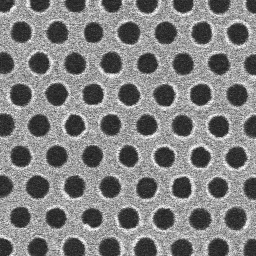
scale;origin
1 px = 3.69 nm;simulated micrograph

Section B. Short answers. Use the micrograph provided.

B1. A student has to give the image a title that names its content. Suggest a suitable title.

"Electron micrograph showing a regular array of holes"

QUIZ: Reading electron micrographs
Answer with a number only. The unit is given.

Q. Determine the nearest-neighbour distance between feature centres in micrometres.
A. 0.13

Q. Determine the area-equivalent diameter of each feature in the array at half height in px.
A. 19.9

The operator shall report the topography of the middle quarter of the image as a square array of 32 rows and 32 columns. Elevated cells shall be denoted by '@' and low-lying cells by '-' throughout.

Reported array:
-----@@@@-----@@@@-----@@@@-----
@----@@@@@----@@@@@----@@@@@----
@@-@@@@@@@@@@@@@@@@@@@@@@@@@@-@@
@@@@@@@@@@@@@@@@@@@@@@@@@@@@@@@@
@@@@@@@@@@@@@@@@@@@@@@@@@@@@@@@@
@@@@@@---@@@@@@---@@@@@@--@@@@@@
-@@@@-----@@@@----@@@@@----@@@@@
-@@@@-----@@@@-----@@@@-----@@@@
-@@@@-----@@@@-----@@@@-----@@@@
@@@@@----@@@@@@---@@@@@----@@@@@
@@@@@@@@@@@@@@@@@@@@@@@@@-@@@@@@
@@@@@@@@@@@@@@@@@@@@@@@@@@@@@@@@
@@@@@@@@@@@@@@@@@@@@@@@@@@@@@@@@
@---@@@@@@---@@@@@@---@@@@@@---@
-----@@@@-----@@@@-----@@@@-----
-----@@@@-----@@@@-----@@@@-----
-----@@@@@----@@@@-----@@@@-----
@---@@@@@@@--@@@@@@---@@@@@@---@
@@@@@@@@@@@@@@@@@@@@@@@@@@@@@@@@
@@@@@@@@@@@@@@@@@@@@@@@@@@@@@@@@
@@@@@@@-@@@@@@@@@@@@@@@@@@@@@@@@
@@@@@----@@@@@----@@@@@---@@@@@@
-@@@@-----@@@@----@@@@@----@@@@@
-@@@-----@@@@@----@@@@-----@@@@@
@@@@@----@@@@@----@@@@@----@@@@@
@@@@@@--@@@@@@@@-@@@@@@@--@@@@@@
@@@@@@@@@@@@@@@@@@@@@@@@@@@@@@@@
@@@@@@@@@@@@@@@@@@@@@@@@@@@@@@@@
@---@@@@@@---@@@@@@@-@@@@@@@@--@
-----@@@@-----@@@@@----@@@@----@
-----@@@@-----@@@@-----@@@@-----
-----@@@@-----@@@@-----@@@@-----